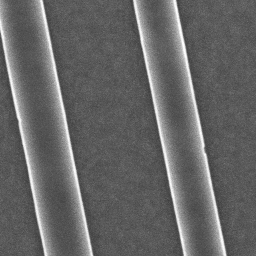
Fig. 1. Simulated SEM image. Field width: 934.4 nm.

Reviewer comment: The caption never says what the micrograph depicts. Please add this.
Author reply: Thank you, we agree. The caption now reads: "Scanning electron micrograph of one or a few lines or trenches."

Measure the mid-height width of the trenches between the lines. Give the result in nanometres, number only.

331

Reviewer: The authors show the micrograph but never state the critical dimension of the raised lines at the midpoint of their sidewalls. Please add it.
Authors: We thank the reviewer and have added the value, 0.149 um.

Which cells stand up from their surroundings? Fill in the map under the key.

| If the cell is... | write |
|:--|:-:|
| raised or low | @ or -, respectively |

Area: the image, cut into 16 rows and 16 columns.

@@@-----@@@-----
@@@------@@-----
@@@------@@-----
@@@------@@@----
-@@------@@@----
-@@@-----@@@----
-@@@------@@----
-@@@------@@----
-@@@------@@@---
--@@------@@@---
--@@@-----@@@---
--@@@------@@---
--@@@------@@---
--@@@------@@@--
---@@------@@@--
---@@@-----@@@--